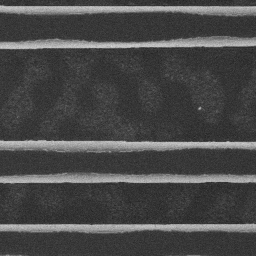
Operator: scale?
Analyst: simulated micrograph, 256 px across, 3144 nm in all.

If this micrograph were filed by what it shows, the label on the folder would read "lines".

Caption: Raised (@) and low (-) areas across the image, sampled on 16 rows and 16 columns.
@---------------
@@@@@@@@@@@@@@@@
@@@@@@@@@@@@@@@@
----------------
----------------
----------------
----------------
----------------
----------------
@@@@@@@@@@@@@@@@
@@@@@@@@@@@@@@@@
----------------
----------------
----------------
@@@@@@@@@@@@@@@@
@@@@@@@@@@@@@@@@